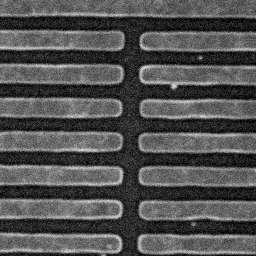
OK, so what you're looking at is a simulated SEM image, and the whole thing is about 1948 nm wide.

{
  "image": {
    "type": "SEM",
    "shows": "groups of lines, slits or small figures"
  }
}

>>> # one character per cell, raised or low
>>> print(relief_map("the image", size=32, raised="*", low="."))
********************************
********************************
................................
................................
***************...**************
***************...**************
................................
................................
***************...**************
***************...**************
.....................*.........*
................................
***************..........***....
***************...**************
.*************....**************
................................
.**.............................
***************..***************
***************...**************
................................
................................
***************..***************
***************..***************
................................
................................
***************...**************
***************..***************
..............................**
................................
***************...****..**..**..
***************..***************
............***...**************